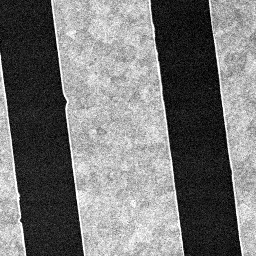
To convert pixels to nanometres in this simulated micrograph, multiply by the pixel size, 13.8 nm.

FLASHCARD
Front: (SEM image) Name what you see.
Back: one or a few lines or trenches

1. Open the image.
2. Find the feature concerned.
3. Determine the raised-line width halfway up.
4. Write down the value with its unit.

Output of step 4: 1350 nm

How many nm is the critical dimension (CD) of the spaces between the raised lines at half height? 811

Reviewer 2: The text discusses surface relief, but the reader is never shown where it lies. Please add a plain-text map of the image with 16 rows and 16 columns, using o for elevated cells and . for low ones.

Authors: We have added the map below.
...oooooo....ooo
...ooooooo...ooo
....oooooo...ooo
....oooooo....oo
....oooooo....oo
....oooooo....oo
....oooooo....oo
o...oooooo....oo
o...oooooo....oo
o...ooooooo...oo
o....oooooo...oo
o....oooooo....o
o....oooooo....o
o....oooooo....o
o....oooooo....o
oo...oooooo....o